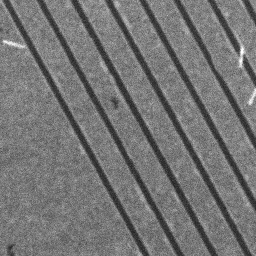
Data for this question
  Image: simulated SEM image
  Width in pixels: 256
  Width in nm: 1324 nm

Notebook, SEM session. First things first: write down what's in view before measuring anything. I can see parallel lines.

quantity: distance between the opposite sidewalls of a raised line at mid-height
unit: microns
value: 0.114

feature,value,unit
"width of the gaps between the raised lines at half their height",0.0413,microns